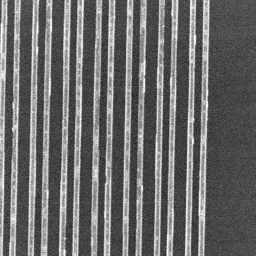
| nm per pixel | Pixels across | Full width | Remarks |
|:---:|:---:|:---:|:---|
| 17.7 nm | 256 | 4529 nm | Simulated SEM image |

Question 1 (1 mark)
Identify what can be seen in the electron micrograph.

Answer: parallel lines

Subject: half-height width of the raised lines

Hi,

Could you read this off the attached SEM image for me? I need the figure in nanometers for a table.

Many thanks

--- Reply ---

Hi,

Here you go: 84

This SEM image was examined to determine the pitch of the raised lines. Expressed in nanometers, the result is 277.